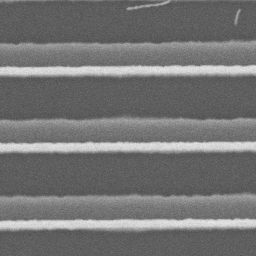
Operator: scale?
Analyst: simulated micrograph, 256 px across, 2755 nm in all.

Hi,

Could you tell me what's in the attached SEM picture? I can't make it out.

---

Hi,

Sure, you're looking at lines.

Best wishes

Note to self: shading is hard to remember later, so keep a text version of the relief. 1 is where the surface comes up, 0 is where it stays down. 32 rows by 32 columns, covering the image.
00000000000000000000000000000000
00000000000000000000000000000000
00000000000000000000000000000000
00000000000000000000000000000000
00000000000000000000000000000000
00010000010000111110111111111111
11111111111111111111111111111111
11111111111111111111111111111111
11111111111111111111111111111111
00000000000000000000000000000000
00000000000000000000000000000000
00000000000000000000000000000000
00000000000000000000000000000000
00000000000000000000000000000000
00000000000000000000000000000000
11111111111111111111111111111111
11111111111111111111111111111111
11111111111111111111111111111111
11111111111111111111111111111111
00000000000000000000000000000000
00000000000000000000000000000000
00000000000000000000000000000000
00000000000000000000000000000000
00000000000000000000000000000000
00000000000000000000000000000000
11111111111111111111111111111111
11111111111111111111111111111111
11111111111111111111111111111111
11111110110000000000000000000000
00000000000000000000000000000000
00000000000000000000000000000000
00000000000000000000000000000000